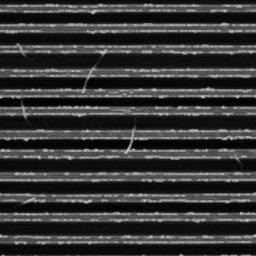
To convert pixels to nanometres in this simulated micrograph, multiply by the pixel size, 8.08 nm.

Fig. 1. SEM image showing parallel lines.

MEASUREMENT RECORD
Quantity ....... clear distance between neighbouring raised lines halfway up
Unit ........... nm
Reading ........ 86.8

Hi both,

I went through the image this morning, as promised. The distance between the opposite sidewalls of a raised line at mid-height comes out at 78.8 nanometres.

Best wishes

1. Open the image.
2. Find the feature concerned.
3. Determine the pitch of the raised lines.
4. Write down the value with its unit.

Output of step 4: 0.17 um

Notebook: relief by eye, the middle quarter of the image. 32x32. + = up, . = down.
................................
++++++++++++++++++++++++++++++++
++++++++++++++++++++++++++++++++
.....++.........................
................................
................................
++++++++++++++++++++++++++++++++
++++++++++++++++++++++++++++++++
................................
................................
................................
++++++++++++++++++++++++++++++++
++++++++++++++++++++++++++++++++
................................
................................
................................
++++++.++.++++++++++++++++++++++
++++++++++++++++++++++++++++++++
++++++++++++++++++++++++++++++++
................................
................+...............
++++++++++++++++++++++++++++++++
++++++++++++++++++++++++++++++++
++++++++++++++++++++++++++++++++
................................
................................
................................
++++++++++++++++++++++++++++++++
++++++++++++++++++++++++++++++++
................................
................................
................................